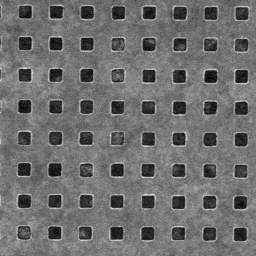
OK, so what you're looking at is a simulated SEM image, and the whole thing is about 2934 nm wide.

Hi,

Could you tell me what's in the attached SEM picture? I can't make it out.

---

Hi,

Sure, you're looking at a regular array of holes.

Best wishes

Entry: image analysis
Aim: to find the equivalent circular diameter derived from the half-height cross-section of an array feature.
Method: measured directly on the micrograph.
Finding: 15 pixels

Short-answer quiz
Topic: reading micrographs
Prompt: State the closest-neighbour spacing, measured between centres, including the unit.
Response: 353 nanometers